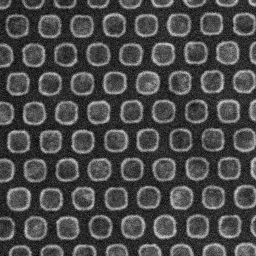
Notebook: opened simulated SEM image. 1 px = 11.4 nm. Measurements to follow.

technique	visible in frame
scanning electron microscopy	a regular array of raised bodies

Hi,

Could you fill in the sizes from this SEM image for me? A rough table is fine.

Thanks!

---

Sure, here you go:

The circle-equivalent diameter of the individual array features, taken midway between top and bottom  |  257 nm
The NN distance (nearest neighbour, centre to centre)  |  366 nanometers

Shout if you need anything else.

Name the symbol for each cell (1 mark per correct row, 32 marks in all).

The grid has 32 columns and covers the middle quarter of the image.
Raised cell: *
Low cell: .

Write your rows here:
................................
................................
...***.....***.....****....****.
..*****...*****...*****...******
..*****...*****...*****...******
..*****...*****...*****...******
..*****...*****...*****....****.
................................
................................
.................*.....***......
***...*****....****...*****....*
***...*****...*****...*****...**
***...*****...******...*****...*
***...*****...*****....****....*
**.....***.....***..............
................................
....................***.....**..
...****....****....*****...*****
..*****...******..******...*****
..*****...******..******...*****
..*****...******...****....*****
...****....****....***......***.
................................
................................
***....****....****....****....*
***...*****...******...*****...*
***...*****...******...*****...*
***...*****...*****....*****...*
***....****....****....****.....
................................
................................
...****....****....****....****.